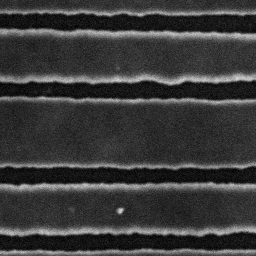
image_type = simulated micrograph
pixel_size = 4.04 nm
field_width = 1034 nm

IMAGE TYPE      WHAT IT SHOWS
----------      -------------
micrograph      lines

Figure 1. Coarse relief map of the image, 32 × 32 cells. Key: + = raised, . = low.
++++++++++++++++++++++++++++++++
++++++++++++++++++++++++++++++++
................................
................................
++++++++++++++++++++++++++++++++
++++++++++++++++++++++++++++++++
++++++++++++++++++++++++++++++++
++++++++++++++++++++++++++++++++
++++++++++++++++++++++++++++++++
++++++++++++++++++++++++++++++++
................................
................................
+++++++++++++++..+++.++++.......
++++++++++++++++++++++++++++++++
++++++++++++++++++++++++++++++++
++++++++++++++++++++++++++++++++
++++++++++++++++++++++++++++++++
++++++++++++++++++++++++++++++++
++++++++++++++++++++++++++++++++
++++++++++++++++++++++++++++++++
++++++++++++++++++++++++++++++++
................................
................................
++++++++++++++++++++++++++++++++
++++++++++++++++++++++++++++++++
++++++++++++++++++++++++++++++++
++++++++++++++++++++++++++++++++
++++++++++++++++++++++++++++++++
++++++++++++++++++++++++++++++++
................................
................................
++++++++.+++++++++++++++++++++++